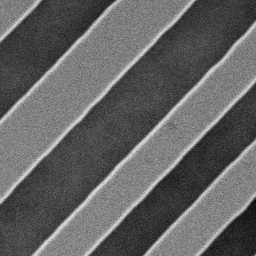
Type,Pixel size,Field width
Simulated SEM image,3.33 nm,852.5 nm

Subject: groups of lines, slits or small figures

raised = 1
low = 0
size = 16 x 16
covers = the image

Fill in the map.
1100000111110000
1000001111100000
0000011111000001
0000111110000011
0001111100000111
0011111000001111
0111110000011110
1111100000111100
1111000001111000
1110000011110001
1100000111100011
1000001111000111
0000011110001111
0000111100011110
0001111000111100
0001110001111000